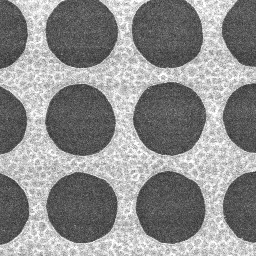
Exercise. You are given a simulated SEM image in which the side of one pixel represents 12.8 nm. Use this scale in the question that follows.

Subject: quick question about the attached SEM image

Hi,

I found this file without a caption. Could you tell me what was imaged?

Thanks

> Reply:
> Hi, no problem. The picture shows holes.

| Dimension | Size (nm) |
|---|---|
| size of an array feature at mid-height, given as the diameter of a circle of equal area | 916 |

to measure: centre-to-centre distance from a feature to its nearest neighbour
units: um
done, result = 1.13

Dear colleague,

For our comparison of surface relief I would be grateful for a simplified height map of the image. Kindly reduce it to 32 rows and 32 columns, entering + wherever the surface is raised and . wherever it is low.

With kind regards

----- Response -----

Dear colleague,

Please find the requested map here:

..+++++......+++++......+++++...
...+++........+++........+++....
...+++........+++........+++....
...+++.........+.........+++....
...+++.........++........+++....
...+++........+++........+++....
...+++........+++........++++...
..+++++......+++++......++++++..
.+++++++++.+++++++++..++++++++++
++++++++++++++++++++++++++++++++
+++++++++..+++++++++...++++++++.
.++++++......+++++......+++++...
..++++.......++++........+++....
...+++........+++.........++....
...+++........+++.........++....
...+++.........++.........++....
...+++........+++........+++....
...+++........++++.......++++...
..+++++......+++++......++++++..
++++++++++++++++++++++++++++++++
++++++++++++++++++++++++++++++++
++++++++++++++++++++..++++++++++
..+++++......+++++......+++++...
...+++........++++.......+++....
...+++........+++........+++....
....++.........++.........++....
....++.........++.........++....
...+++........+++.........++....
...++++.......++++.......++++...
..++++++.....++++++.....++++++..
.++++++++++++++++++++.++++++++++
++++++++++++++++++++++++++++++++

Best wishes